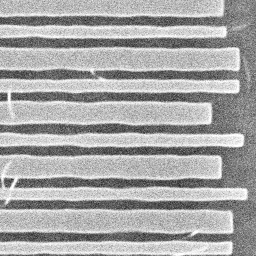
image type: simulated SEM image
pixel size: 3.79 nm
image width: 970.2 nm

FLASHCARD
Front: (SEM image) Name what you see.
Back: groups of lines, slits or small figures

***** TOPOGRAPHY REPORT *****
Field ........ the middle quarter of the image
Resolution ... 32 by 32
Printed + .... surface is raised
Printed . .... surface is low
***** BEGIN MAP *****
++++++++++++++++++++++++++++++++
.....+++........+++++........++.
................................
................................
++++++++++++++++++++++++++++++++
++++++++++++++++++++++++++++++++
++++++++++++++++++++++++++++++++
................................
................................
................................
++++++++++++++++++++++++++++++++
++++++++++++++++++++++++++++++++
++++++++++++++++++++++++++++++++
++++++++++++++++++++++++++++++++
++++++++++++++++++++++++++++++++
................................
................................
................++..............
++++++++++++++++++++++++++++++++
++++++++++++++++++++++++++++++++
....++++.....+++++..............
................................
................................
++++++++++++++++++++++++++++++++
++++++++++++++++++++++++++++++++
++++++++++++++++++++++++++++++++
++++++++++++++++++++++++++++++++
++++++++++++++++++++++++++++++++
......................+++++++...
................................
................................
++++++++++++++++++++++++++++++++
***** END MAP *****